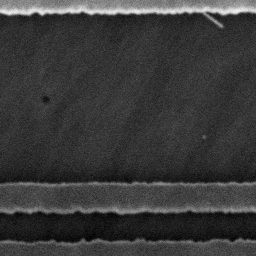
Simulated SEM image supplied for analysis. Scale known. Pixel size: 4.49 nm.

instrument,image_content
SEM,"lines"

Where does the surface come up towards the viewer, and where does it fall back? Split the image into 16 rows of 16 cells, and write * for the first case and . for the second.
****************
................
................
................
................
................
................
................
................
................
................
****************
****************
................
................
****************